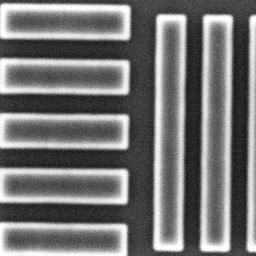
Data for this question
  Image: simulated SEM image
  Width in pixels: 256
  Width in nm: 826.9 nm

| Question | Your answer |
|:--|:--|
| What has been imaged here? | groups of lines, slits or small figures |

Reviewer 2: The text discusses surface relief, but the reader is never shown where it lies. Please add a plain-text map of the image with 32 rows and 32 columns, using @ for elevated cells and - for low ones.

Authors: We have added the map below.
--------------------------------
@@@@@@@@@@@@@@@@----------------
@@@@@@@@@@@@@@@@----@@@---@@@---
@@@@@@@@@@@@@@@@----@@@---@@@--@
--@@@@@@@@@@@@@@----@@@---@@@--@
--------------------@@@---@@@--@
--------------------@@@---@@@--@
--------------------@@@---@@@--@
@@@@@@@@@@@@@@@@----@@@---@@@--@
@@@@@@@@@@@@@@@@----@@@---@@@--@
@@@@@@@@@@@@@@@@----@@@---@@@--@
-----------@@@@-----@@@---@@@--@
--------------------@@@---@@@--@
--------------------@@@---@@@--@
@@@@@@--------------@@@--@@@@--@
@@@@@@@@@@@@@@@@----@@@--@@@@--@
@@@@@@@@@@@@@@@@----@@@--@@@@--@
@@@@@@@@@@@@@@@@----@@@--@@@@--@
--------------------@@@--@@@@--@
--------------------@@@--@@@@--@
--------------------@@@--@@@@--@
@@@@@@@@@@@@@@@-----@@@--@@@@--@
@@@@@@@@@@@@@@@@----@@@--@@@@--@
@@@@@@@@@@@@@@@@----@@@--@@@@--@
@@@@@@@@@@@@@@@@----@@@--@@@@--@
--------------------@@@--@@@@--@
--------------------@@@--@@@---@
--------------------@@@--@@@---@
@@@@@@@@@@@@@@@-----@@@--@@@---@
@@@@@@@@@@@@@@@@----@@@--@@@---@
@@@@@@@@@@@@@@@@----@@@--@@@---@
@@@@@@@@@@@@@@@@----------------